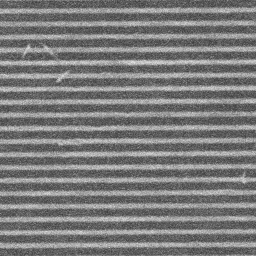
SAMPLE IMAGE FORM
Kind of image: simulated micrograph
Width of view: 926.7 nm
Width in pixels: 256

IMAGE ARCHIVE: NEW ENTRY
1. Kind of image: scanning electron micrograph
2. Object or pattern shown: parallel lines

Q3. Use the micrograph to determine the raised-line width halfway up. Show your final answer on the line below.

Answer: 13.1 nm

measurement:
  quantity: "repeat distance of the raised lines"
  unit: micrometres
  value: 0.0472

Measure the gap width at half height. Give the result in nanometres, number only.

32.6